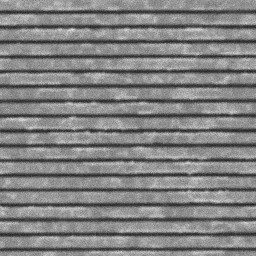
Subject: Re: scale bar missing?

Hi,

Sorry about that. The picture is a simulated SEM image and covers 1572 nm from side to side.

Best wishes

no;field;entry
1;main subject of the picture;parallel lines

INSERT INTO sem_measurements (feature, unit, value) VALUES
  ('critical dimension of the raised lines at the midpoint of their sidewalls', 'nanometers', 65.2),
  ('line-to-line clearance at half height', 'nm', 29.1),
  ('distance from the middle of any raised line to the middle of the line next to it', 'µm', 0.091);